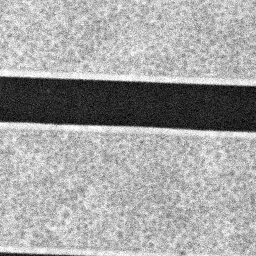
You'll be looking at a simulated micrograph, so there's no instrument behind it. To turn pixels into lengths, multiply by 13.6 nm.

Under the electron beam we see one or a few lines or trenches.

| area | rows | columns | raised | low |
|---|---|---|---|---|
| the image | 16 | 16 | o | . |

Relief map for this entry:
oooooooooooooooo
oooooooooooooooo
oooooooooooooooo
oooooooooooooooo
oooooooooooooooo
................
................
................
oooooooooooooooo
oooooooooooooooo
oooooooooooooooo
oooooooooooooooo
oooooooooooooooo
oooooooooooooooo
oooooooooooooooo
oooooooooooooooo